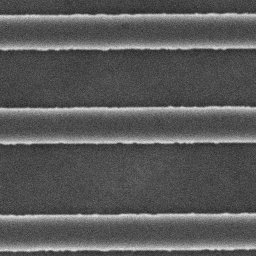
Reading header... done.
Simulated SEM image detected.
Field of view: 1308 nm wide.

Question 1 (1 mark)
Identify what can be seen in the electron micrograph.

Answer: lines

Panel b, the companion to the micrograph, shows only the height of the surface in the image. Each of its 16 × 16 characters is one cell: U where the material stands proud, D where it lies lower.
DDDDDDDDDDDDDDDD
UUUUUUUUUUUUUUUU
UUUUUUUUUUUUUUUU
DDDDDDDDDDDDDDDD
DDDDDDDDDDDDDDDD
DDDDDDDDDDDDDDDD
DDDDDDDDDDDDDDDD
UUUUUUUUUUUUUUUU
UUUUUUUUUUUUUUUU
DDDDDDDDDDDDDDDD
DDDDDDDDDDDDDDDD
DDDDDDDDDDDDDDDD
DDDDDDDDDDDDDDDD
UUUUUUUUUUUUUUUU
UUUUUUUUUUUUUUUU
UUUUUUUUUUUUUUUU